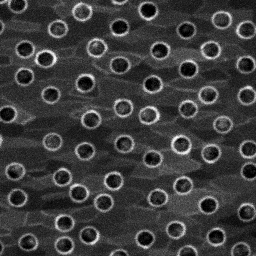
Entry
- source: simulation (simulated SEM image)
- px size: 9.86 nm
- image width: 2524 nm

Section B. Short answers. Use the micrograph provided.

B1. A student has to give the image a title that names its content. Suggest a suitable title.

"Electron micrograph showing a regular array of holes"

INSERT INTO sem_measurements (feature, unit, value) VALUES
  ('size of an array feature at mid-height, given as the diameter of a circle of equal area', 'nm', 160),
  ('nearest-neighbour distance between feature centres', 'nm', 292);